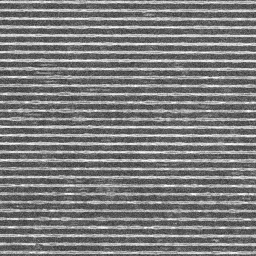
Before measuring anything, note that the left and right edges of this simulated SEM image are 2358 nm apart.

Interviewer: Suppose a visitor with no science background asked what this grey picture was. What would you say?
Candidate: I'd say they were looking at parallel lines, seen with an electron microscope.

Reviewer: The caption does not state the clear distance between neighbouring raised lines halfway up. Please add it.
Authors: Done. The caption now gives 6.5 pixels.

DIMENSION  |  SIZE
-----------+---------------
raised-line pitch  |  76.9 nm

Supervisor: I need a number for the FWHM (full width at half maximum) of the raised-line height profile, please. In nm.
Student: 17.3